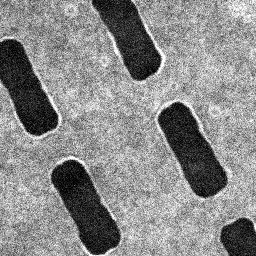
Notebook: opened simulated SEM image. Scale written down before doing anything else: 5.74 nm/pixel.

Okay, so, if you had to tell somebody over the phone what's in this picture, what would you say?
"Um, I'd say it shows holes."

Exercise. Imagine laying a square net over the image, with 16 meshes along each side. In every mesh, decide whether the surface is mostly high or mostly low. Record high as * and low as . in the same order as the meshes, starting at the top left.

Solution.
******...*******
******...*******
.******...******
..******..******
..******..******
...*************
*..*************
*...******..****
**********...***
***********..***
***..******...**
***...******..**
****..**********
****...*********
*****...******..
*****..*******..